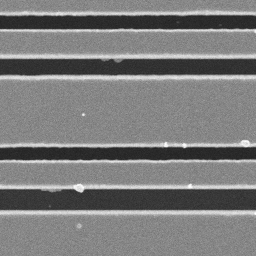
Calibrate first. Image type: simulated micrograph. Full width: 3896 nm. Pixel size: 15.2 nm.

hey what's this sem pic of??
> lines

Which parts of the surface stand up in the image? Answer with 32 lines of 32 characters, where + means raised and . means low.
++++++++++++++++++++++++++++++++
++++++++++++++++++++++++++++++++
................................
................................
++++++++++++++++++++++++++++++++
++++++++++++++++++++++++++++++++
++++++++++++++++++++++++++++++++
................................
................................
+++..++++++++.++++++++++++++++++
++++++++++++++++++++++++++++++++
++++++++++++++++++++++++++++++++
++++++++++++++++++++++++++++++++
++++++++++++++++++++++++++++++++
++++++++++++++++++++++++++++++++
++++++++++++++++++++++++++++++++
++++++++++++++++++++++++++++++++
++++++++++++++++++++++++++++++++
................................
................................
++++++++++++++++++++++++++++++++
++++++++++++++++++++++++++++++++
++++++++++++++++++++++++++++++++
++++++++++++++++++++++++++++++++
................................
................................
++++++++++++++++++++++++++++++++
++++++++++++++++++++++++++++++++
++++++++++++++++++++++++++++++++
++++++++++++++++++++++++++++++++
++++++++++++++++++++++++++++++++
++++++++++++++++++++++++++++++++